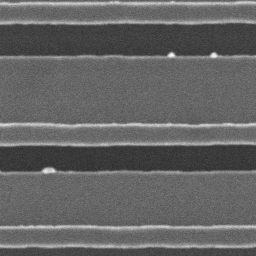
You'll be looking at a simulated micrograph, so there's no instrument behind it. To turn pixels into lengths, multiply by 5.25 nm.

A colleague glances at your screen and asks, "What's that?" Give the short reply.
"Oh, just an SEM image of lines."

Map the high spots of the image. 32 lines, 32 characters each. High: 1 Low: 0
11111111111111111111111111111111
11111111111111111111111111111111
11111111111111111111111111111111
00000000000000000000000000000000
00000000000000000000000000000000
00000000000000000000000000000000
00000000000000000000000000000000
11111111111111111111111111111111
11111111111111111111111111111111
11111111111111111111111111111111
11111111111111111111111111111111
11111111111111111111111111111111
11111111111111111111111111111111
11111111111111111111111111111111
11111111111111111111111111111111
11111111111111111111111111111111
11111111111111111111111111111111
11111111111111111111111111111111
00000000000000000000000000000000
00000000000000000000000000000000
00000000000000000000000000000000
00000111100001111101111000111111
11111111111111111111111111111111
11111111111111111111111111111111
11111111111111111111111111111111
11111111111111111111111111111111
11111111111111111111111111111111
11111111111111111111111111111111
11111111111111111111111111111111
11111111111111111111111111111111
11111111111111111111111111111111
00000000000000000000000000000000